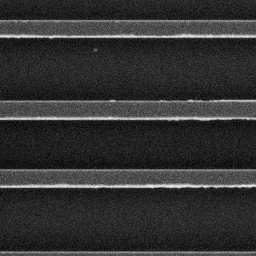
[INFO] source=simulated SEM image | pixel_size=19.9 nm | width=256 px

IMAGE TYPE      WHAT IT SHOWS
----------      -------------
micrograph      lines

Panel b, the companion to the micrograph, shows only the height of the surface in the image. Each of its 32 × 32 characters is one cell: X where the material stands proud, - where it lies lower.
--------------------------------
--------------------------------
--------------------------------
XXXXXXXXXXXXXXXXXXXXXXXXXXXXXXXX
XXXXXXXXXXXXXXXXXXXXXXXXXXXXXXXX
--------------------------------
--------------------------------
--------------------------------
--------------------------------
--------------------------------
--------------------------------
--------------------------------
--------------------------------
XXXXXXXXXXXXXXXXXXXXXXXXXXXXXXXX
XXXXXXXXXXXXXXXXXXXXXXXXXXXXXXXX
--------------------------------
--------------------------------
--------------------------------
--------------------------------
--------------------------------
--------------------------------
XXXXXXXXXXXXXXXXXXXXXXXXXXXXXXXX
XXXXXXXXXXXXXXXXXXXXXXXXXXXXXXXX
--------------------------------
--------------------------------
--------------------------------
--------------------------------
--------------------------------
--------------------------------
--------------------------------
--------------------------------
--------------------------------